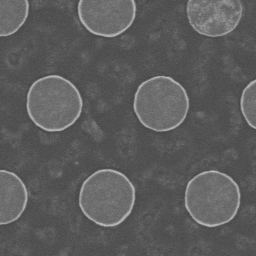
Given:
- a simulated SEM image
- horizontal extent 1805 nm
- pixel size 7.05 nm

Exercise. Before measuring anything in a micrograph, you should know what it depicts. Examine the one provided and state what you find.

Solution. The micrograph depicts raised bodies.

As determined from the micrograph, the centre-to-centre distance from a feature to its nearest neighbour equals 749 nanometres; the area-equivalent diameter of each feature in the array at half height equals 384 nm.